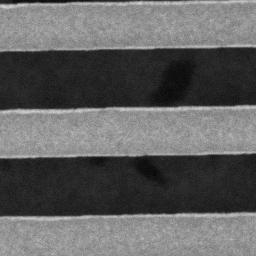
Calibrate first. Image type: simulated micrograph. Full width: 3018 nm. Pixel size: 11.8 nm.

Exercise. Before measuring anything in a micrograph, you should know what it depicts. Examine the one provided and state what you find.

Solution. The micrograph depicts lines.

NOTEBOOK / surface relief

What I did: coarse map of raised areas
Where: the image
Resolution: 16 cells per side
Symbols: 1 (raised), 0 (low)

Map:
1111111111111111
1111111111111111
1111111111111111
0000000000000000
0000000000000000
0000000000000000
0000000000000000
1111111111111111
1111111111111111
1111111111111111
0000000000000000
0000000000000000
0000000000000000
0000000111111111
1111111111111111
1111111111111111